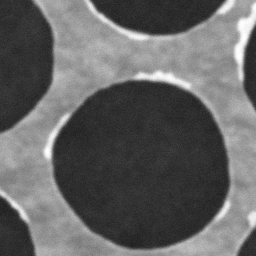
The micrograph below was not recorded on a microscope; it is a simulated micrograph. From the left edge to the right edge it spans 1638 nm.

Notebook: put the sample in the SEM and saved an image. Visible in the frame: holes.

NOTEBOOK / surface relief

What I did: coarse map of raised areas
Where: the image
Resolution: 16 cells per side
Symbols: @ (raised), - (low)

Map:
--@@@@--------@@
---@@@@------@@@
---@@@@@@@@@@@@-
---@@@@@@@@@@@@-
---@@@@@@@@@@@@-
---@@@-----@@@@-
--@@@--------@@@
-@@@---------@@@
@@@@----------@@
@@@-----------@@
@@@-----------@@
@@@-----------@@
@@@@----------@@
-@@@@---------@@
--@@@@-------@@@
--@@@@@@--@@@@@-